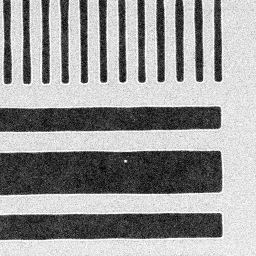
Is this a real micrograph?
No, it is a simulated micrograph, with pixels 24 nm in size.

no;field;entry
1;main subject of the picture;groups of lines, slits or small figures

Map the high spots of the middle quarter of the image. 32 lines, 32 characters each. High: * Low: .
*...**...**...**..**...**...**..
*...**...**...**..**...**...**..
*...**...**...**..***..**...**..
*...**...**...**..***..**...**..
*...**...**...*....*...**...**..
................................
................................
................................
................................
................................
................................
********************************
********************************
********************************
********************************
********************************
*******************************.
................................
................................
................................
................................
............................**..
********************************
********************************
********************************
********************************
********************************
********************************
********************************
********************************
********************************
********************************